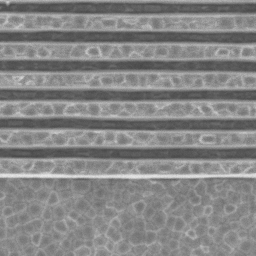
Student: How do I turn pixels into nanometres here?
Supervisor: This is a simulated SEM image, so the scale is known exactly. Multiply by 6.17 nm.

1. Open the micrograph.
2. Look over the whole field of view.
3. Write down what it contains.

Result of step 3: parallel lines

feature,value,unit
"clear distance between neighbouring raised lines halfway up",0.0763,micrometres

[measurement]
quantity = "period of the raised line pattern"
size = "179 nm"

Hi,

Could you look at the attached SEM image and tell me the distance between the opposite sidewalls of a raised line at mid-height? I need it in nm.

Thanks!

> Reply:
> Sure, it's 104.